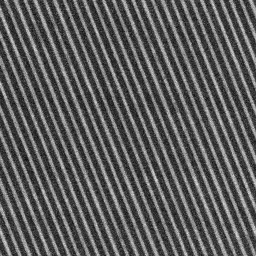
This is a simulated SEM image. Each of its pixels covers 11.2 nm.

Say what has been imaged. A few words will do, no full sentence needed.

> parallel lines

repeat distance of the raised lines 9.09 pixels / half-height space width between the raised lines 88.7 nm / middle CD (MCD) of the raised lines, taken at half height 1.62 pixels